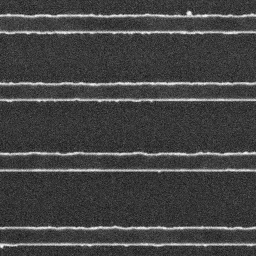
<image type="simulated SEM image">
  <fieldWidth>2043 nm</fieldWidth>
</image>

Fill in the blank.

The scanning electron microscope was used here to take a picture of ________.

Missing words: lines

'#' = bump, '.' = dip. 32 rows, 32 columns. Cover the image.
................................
................................
################################
################################
................................
................................
................................
................................
................................
................................
######.####...##################
################################
################################
................................
................................
................................
................................
................................
................................
################################
################################
................................
................................
................................
................................
................................
................................
................................
################################
################################
################################
................................